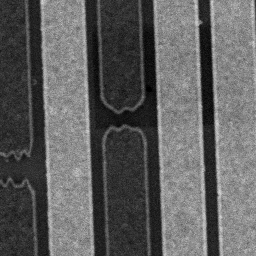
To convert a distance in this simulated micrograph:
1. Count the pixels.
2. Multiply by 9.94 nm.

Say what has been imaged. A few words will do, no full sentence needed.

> parallel lines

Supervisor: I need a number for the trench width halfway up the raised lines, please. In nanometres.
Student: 149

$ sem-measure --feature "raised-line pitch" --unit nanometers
562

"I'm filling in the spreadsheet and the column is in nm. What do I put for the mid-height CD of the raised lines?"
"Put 407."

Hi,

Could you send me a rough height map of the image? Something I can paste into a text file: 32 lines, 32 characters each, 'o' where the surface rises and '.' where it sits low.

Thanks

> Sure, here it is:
ooo..ooooo..ooooo..ooooo...ooooo
ooo..ooooo..ooooo..oooooo..ooooo
ooo..ooooo..oooooo..ooooo..ooooo
ooo..ooooo..oooooo..ooooo..ooooo
ooo..oooooo.oooooo..ooooo..ooooo
ooo..oooooo..ooooo..ooooo..ooooo
ooo..oooooo..ooooo..ooooo..ooooo
oooo..ooooo..ooooo..ooooo..ooooo
oooo..ooooo..ooooo..ooooo..ooooo
oooo..ooooo..ooooo..ooooo..ooooo
oooo..ooooo..ooooo..ooooo..ooooo
oooo..ooooo..ooooo..ooooo..ooooo
oooo..ooooo..ooooo..ooooo..ooooo
oooo..ooooo...ooo...ooooo..ooooo
oooo..ooooo.........ooooo..ooooo
oooo..ooooo.........ooooo..ooooo
oooo..ooooo..ooooo..ooooo..ooooo
oooo..ooooo..ooooo..ooooo..ooooo
oooo..ooooo..ooooo..ooooo..ooooo
......ooooo..ooooo..ooooo..ooooo
......ooooo..ooooo..ooooo..ooooo
......ooooo..ooooo..ooooo..ooooo
......ooooo..ooooo..ooooo..ooooo
oooo..ooooo..ooooo..ooooo..ooooo
oooo..ooooo..ooooo..ooooo..ooooo
oooo..ooooo..ooooo..ooooo..ooooo
oooo..ooooo..ooooo..ooooo...oooo
oooo..ooooo..ooooo..ooooo...oooo
oooo..ooooo..oooooo.oooooo..oooo
oooo..ooooo..oooooo..ooooo..oooo
oooo..ooooo..oooooo..ooooo..oooo
oooo..oooooo.oooooo..ooooo..oooo